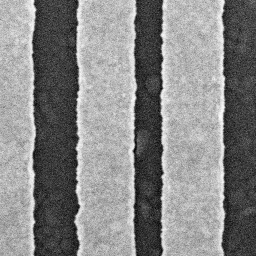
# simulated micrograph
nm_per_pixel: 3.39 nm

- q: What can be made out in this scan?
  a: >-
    lines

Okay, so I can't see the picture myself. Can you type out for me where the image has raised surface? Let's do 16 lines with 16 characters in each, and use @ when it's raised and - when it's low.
@@---@@@--@@@@--
@@---@@@--@@@@--
@@---@@@--@@@@--
@@---@@@--@@@@--
@@---@@@--@@@@--
@@---@@@--@@@@--
@@---@@@--@@@@--
@@---@@@--@@@@--
@@---@@@--@@@@--
@@---@@@--@@@@--
@@---@@@--@@@@--
@@---@@@--@@@@--
@@---@@@--@@@@--
@@---@@@--@@@@--
@@---@@@--@@@@--
@@---@@@--@@@@--